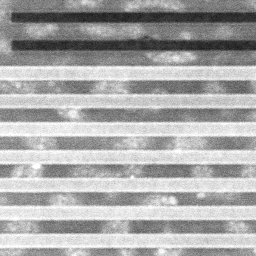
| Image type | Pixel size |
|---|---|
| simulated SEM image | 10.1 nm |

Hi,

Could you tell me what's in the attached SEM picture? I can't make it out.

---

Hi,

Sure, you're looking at parallel lines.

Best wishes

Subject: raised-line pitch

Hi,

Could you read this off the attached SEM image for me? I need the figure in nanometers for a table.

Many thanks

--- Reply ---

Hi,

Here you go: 282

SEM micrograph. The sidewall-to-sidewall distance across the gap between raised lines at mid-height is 158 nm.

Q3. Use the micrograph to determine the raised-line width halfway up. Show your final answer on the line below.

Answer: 126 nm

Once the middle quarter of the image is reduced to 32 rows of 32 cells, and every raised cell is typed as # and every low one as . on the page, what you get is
................................
################################
################################
################################
................................
................................
................................
................................
################################
################################
################################
................................
.##.............................
................................
................................
################################
################################
################################
................................
................................
................................
................................
################################
################################
################################
................................
................................
.............#..................
.................#..............
################################
################################
################################